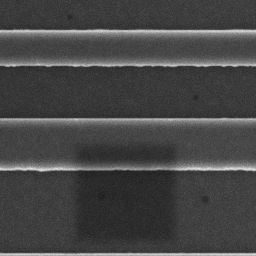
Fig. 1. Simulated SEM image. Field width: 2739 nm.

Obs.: lines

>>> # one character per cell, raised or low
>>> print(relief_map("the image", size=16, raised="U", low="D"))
DDDDDDDDDDDDDDDD
DDDDDDDDDDDDDDDD
UUUUUUUUUUUUUUUU
UUUUUUUUUUUUUUUU
DDDDDDDDDDDDDDDD
DDDDDDDDDDDDDDDD
DDDDDDDDDDDDDDDD
UUUUUUUUUUUUUUUU
UUUUUUUUUUUUUUUU
UUUUUUUUUUUUUUUU
UUUUUUUUUUUUUUUU
DDDDDDDDDDDDDDDD
DDDDDDDDDDDDDDDD
DDDDDDDDDDDDDDDD
DDDDDDDDDDDDDDDD
DDDDDDDDDDDDDDDD